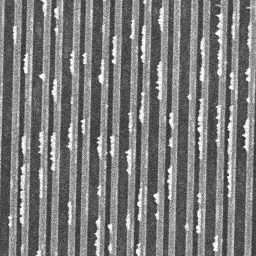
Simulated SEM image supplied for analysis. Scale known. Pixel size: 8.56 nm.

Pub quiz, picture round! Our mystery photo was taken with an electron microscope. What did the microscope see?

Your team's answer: parallel lines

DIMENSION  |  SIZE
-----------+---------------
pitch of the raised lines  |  125 nm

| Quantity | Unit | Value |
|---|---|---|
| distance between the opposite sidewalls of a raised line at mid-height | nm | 52.4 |